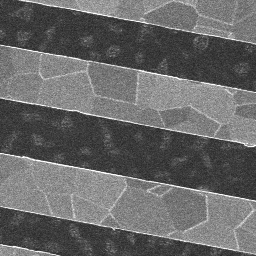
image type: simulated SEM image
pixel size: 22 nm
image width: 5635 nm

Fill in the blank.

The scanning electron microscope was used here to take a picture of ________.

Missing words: one or a few lines or trenches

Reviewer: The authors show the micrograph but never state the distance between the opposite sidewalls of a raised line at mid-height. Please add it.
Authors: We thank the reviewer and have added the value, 1.15 µm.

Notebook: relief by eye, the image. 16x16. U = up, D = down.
DDDDUUUUUUUUUUUU
DDDDDDDDDUUUUUUU
DDDDDDDDDDDDDDDU
UUUUDDDDDDDDDDDD
UUUUUUUUUDDDDDDD
UUUUUUUUUUUUUUUD
DDUUUUUUUUUUUUUU
DDDDDDDUUUUUUUUU
DDDDDDDDDDDDDUUU
DDDDDDDDDDDDDDDD
UUUUUDDDDDDDDDDD
UUUUUUUUUUDDDDDD
UUUUUUUUUUUUUUUU
DDDUUUUUUUUUUUUU
DDDDDDDDUUUUUUUU
UDDDDDDDDDDDDDUU